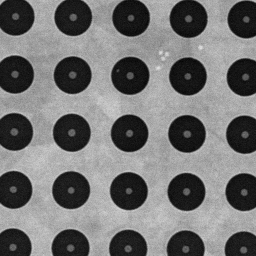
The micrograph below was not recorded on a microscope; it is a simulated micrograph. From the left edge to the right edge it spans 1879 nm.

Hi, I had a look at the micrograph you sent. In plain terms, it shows an array of small figures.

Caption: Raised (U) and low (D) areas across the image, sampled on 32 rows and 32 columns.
DDDDUUUDDDDUUUUDDDUUUUDDDUUUUDDD
DDDDUUUDDDDUUUDDDDDUUDDDDDUUUDDD
DDDDUUUDDDDUUUDDDDDUUDDDDDUUDDDD
DDDDUUUDDDDUUUDDDDUUUDDDDDUUUDDD
UUUUUUUUUDUUUUUUDUUUUUDDDUUUUUDD
UUUUUUUUUUUUUUUUUUUUUUUUUUUUUUUU
UUUUUUUUUUUUUUUUUUUUUUUUUUUUUUUU
DDDUUUUUDDUUUUUDDDUUUUDDDUUUUUDD
DDDDUUUDDDDUUUDDDDDUUDDDDDUUUDDD
DDDDUUUDDDDUUUDDDDDUUDDDDDUUDDDD
DDDDUUUDDDDUUUDDDDUUUDDDDDUUDDDD
UDDUUUUUDDUUUUUDDDUUUUDDDUUUUDDD
UUUUUUUUUUUUUUUUUUUUUUUUUUUUUUUU
UUUUUUUUUUUUUUUUUUUUUUUUUUUUUUUU
DDDUUUUUDDUUUUUDDUUUUUDDUUUUUUDU
DDDDUUUDDDDUUUDDDDUUUDDDDUUUUDDD
DDDDUUUDDDDUUUDDDDDUUDDDDDUUDDDD
DDDDUUUDDDDUUUDDDDUUUDDDDDUUDDDD
UDDUUUUUDDUUUUUDDDUUUUDDDUUUUDDD
UUUUUUUUUUUUUUUUUUUUUUUUUUUUUUUU
UUUUUUUUUUUUUUUUUUUUUUUUUUUUUUUU
UDDUUUUUDDUUUUUUUUUUUUUUUUUUUUUU
DDDDUUUDDDDUUUDDDDUUUDDDDUUUUDDD
DDDDUUUDDDDUUUDDDDUUUDDDDDUUDDDD
DDDDUUUDDDDUUUDDDDUUUDDDDDUUDDDD
DDDUUUUDDDDUUUDDDDUUUDDDDUUUUDDD
UUUUUUUUUUUUUUUUUUUUUUUUUUUUUUUU
UUUUUUUUUUUUUUUUUUUUUUUUUUUUUUUU
UDUUUUUUUUUUUUUUUUUUUUUUUUUUUUUU
DDDUUUUDDDDUUUDDDDUUUUDDDUUUUDDD
DDDDUUDDDDDUUUDDDDUUUDDDDDUUDDDD
DDDDUUDDDDDUUUDDDDUUUDDDDDUUDDDD